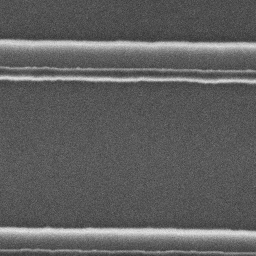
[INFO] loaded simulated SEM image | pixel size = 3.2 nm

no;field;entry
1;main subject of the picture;lines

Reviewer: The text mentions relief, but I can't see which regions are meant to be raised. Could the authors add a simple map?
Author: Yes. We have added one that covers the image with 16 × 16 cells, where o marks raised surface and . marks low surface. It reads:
................
................
................
oooooooooooooooo
oooooooooooooooo
................
................
................
................
................
................
................
................
................
ooooooooooo.....
oooooooooooooooo